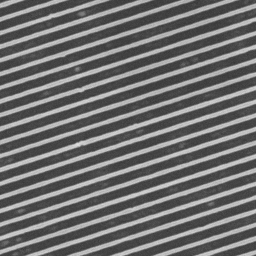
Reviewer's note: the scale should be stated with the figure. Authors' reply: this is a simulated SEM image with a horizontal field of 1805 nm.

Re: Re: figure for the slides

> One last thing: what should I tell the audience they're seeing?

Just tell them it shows parallel lines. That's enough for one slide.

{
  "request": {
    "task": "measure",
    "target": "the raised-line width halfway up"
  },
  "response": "0.0252 microns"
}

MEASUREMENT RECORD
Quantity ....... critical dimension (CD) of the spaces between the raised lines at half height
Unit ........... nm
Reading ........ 70.5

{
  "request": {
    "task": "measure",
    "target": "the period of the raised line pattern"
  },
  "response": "91.9 nm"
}